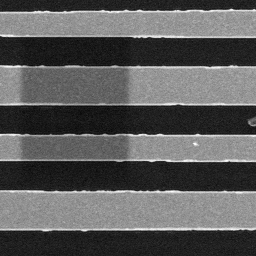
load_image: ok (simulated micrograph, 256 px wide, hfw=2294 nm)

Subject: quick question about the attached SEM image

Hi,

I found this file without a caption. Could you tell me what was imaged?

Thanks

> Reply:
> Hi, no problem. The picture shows lines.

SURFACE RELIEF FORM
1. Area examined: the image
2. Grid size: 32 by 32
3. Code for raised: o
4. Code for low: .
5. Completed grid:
................................
....ooo.oooooooooooooooooooooooo
oooooooooooooooooooooooooooooooo
oooooooooooooooooooooooooooooooo
oooooooooooooooooooooooooooooooo
................................
................................
................................
oooooooooooooooooooooooooo.ooooo
oooooooooooooooooooooooooooooooo
oooooooooooooooooooooooooooooooo
oooooooooooooooooooooooooooooooo
oooooooooooooooooooooooooooooooo
................................
................................
................................
................................
oooooooooooooooooooooooooooooooo
oooooooooooooooooooooooooooooooo
oooooooooooooooooooooooooooooooo
................................
................................
................................
................................
oooooooooooooooooooooooooooooooo
oooooooooooooooooooooooooooooooo
oooooooooooooooooooooooooooooooo
oooooooooooooooooooooooooooooooo
oooooooooooooooooooooooooooooooo
................................
................................
................................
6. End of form